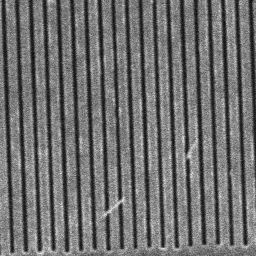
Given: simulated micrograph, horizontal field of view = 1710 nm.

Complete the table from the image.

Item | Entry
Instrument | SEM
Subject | parallel lines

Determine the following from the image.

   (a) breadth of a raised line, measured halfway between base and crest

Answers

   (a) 64.3 nanometers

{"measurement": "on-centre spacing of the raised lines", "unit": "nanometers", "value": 91.6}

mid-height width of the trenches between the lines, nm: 31.7